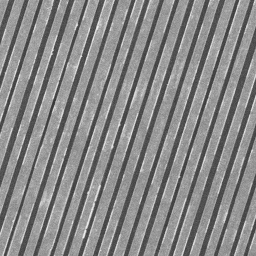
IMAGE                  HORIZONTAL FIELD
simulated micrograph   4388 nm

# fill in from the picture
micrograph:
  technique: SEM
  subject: parallel lines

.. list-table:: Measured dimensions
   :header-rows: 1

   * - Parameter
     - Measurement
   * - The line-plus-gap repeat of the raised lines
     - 0.246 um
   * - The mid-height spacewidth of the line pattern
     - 0.0775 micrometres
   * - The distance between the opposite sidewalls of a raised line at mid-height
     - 0.157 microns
